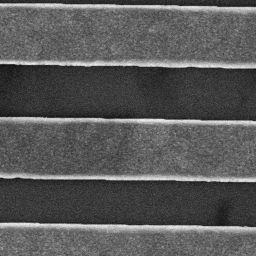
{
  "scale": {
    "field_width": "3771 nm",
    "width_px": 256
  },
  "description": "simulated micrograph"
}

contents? lines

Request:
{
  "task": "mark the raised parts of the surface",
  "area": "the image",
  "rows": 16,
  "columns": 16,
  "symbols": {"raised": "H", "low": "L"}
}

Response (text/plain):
HHHHHHHHHHHHHHLL
HHHHHHHHHHHHHHHH
HHHHHHHHHHHHHHHH
HHHHHHHHHHHHHHHH
LLLLLLLLLLLLLLLL
LLLLLLLLLLLLLLLL
LLLLLLLLLLLLLLLL
HHHHHHHHHLLLLLLL
HHHHHHHHHHHHHHHH
HHHHHHHHHHHHHHHH
HHHHHHHHHHHHHHHH
LLLLLLLLLLLLLLLL
LLLLLLLLLLLLLLLL
LLLLLLLLLLLLLLLL
HHHHHHHHHHHHHHHH
HHHHHHHHHHHHHHHH